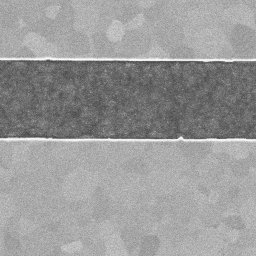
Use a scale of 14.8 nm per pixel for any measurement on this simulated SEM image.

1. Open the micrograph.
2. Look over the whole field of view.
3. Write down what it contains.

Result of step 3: one or a few lines or trenches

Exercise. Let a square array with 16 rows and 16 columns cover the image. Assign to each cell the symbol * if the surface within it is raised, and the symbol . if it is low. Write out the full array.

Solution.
****************
****************
****************
****************
................
................
................
................
................
****************
****************
****************
****************
****************
****************
****************